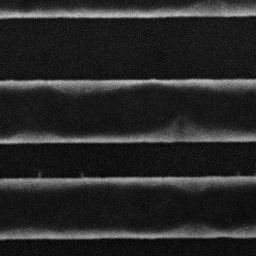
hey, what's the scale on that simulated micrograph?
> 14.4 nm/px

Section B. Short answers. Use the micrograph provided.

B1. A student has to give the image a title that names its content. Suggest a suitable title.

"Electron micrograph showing lines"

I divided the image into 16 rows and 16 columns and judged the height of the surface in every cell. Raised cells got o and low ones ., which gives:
oooooooooooooooo
................
................
................
................
oooooooooooooooo
oooooooooooooooo
oooooooooooooooo
oooooooooooooooo
................
................
oooooooooooooooo
oooooooooooooooo
oooooooooooooooo
oooooooooooooooo
................